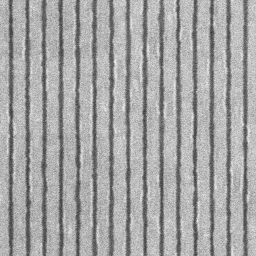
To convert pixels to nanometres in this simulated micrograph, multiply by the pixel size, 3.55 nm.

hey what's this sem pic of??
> parallel lines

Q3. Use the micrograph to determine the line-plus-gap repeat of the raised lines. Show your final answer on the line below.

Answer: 0.0596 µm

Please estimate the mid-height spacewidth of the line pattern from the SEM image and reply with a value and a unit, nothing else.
0.0142 um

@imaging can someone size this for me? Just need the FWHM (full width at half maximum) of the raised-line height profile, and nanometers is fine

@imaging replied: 45.8